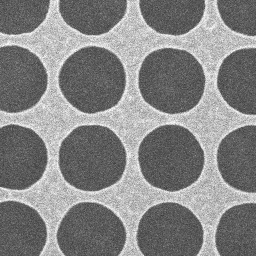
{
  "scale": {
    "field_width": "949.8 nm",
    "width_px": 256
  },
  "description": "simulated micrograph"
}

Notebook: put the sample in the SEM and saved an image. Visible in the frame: holes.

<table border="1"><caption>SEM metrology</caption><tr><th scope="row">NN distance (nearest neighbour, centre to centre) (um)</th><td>0.289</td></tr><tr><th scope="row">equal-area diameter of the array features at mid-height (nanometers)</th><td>250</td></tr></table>